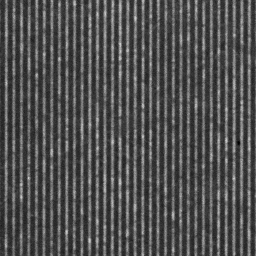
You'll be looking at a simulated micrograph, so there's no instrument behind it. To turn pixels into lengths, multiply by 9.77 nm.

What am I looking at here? parallel lines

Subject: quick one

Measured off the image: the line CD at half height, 17.1 nm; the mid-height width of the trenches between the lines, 56.2 nanometres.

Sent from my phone